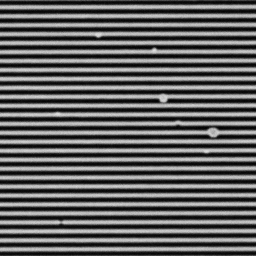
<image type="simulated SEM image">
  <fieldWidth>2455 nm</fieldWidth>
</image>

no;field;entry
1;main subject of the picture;parallel lines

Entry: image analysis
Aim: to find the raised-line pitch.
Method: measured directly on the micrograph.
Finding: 8.97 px